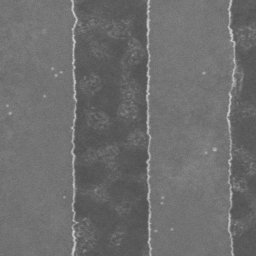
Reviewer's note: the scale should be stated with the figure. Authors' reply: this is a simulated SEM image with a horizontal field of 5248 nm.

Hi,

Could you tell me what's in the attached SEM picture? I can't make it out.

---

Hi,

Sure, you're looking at one or a few lines or trenches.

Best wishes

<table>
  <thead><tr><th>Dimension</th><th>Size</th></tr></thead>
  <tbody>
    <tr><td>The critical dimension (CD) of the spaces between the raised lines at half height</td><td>1670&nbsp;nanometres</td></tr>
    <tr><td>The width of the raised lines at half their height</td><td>1540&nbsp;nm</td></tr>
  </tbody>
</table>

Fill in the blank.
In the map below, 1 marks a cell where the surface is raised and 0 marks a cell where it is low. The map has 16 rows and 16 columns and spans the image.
0000011110000011
0000011110000011
0000011110000001
0000011110000001
0000011110000001
0000011110000001
0000011110000011
0000011110000011
0000011110000011
0000011110000011
0000011110000011
0000011110000011
0000011110000011
0000011110000011
0000011110000011
0000011110000011